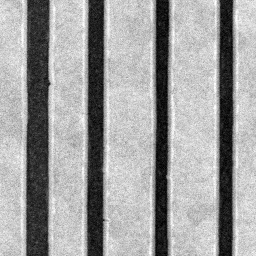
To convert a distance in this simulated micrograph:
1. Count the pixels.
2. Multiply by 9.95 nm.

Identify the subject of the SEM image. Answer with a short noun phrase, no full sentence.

one or a few lines or trenches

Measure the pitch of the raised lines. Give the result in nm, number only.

624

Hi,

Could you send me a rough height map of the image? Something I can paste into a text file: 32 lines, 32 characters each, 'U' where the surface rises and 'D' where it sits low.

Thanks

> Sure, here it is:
UUUDDDDUUUUDDUUUUUUDDUUUUUUDDUUU
UUUDDDDUUUUDDUUUUUUDDUUUUUUDDUUU
UUUDDDDUUUUDDUUUUUUDDUUUUUUDDUUU
UUUDDDDUUUUDDUUUUUUDDDUUUUUDDUUU
UUUDDDDUUUUDDUUUUUUDDUUUUUUDDUUU
UUUDDDDUUUUDDUUUUUUDDUUUUUUDDUUU
UUUDDDUUUUUDDUUUUUUDDUUUUUUDDDUU
UUUDDDUUUUUDDUUUUUUDDUUUUUUDDDUU
UUUDDDUUUUUDDUUUUUUDDUUUUUUDDDUU
UUUDDDUUUUUDDUUUUUUDDUUUUUUDDDUU
UUUDDDUUUUUDDUUUUUUDDUUUUUUDDDUU
UUUDDDUUUUUDDUUUUUUDDUUUUUUDDDUU
UUUDDDUUUUUDDUUUUUUDDUUUUUUDDDUU
UUUDDDUUUUUDDUUUUUUDDUUUUUUDDUUU
UUUDDDUUUUUDDUUUUUUDDUUUUUUDDUUU
UUUDDDUUUUUDDUUUUUUDDUUUUUUDDUUU
UUUDDDUUUUUDDUUUUUUDDUUUUUUDDUUU
UUUDDDUUUUUDDUUUUUUDDUUUUUUDDUUU
UUUDDDUUUUUDDUUUUUUDDUUUUUUDDUUU
UUUDDDUUUUUDDUUUUUUDDUUUUUUDDUUU
UUUDDDUUUUUDDUUUUUUDDUUUUUUDDUUU
UUUDDDUUUUUDDUUUUUUDDUUUUUUDDUUU
UUUDDDUUUUUDDUUUUUUDDUUUUUUDDUUU
UUUDDDUUUUUDDUUUUUUDDUUUUUUDDUUU
UUUDDDUUUUUDDUUUUUUDDUUUUUUDDUUU
UUUDDDUUUUUDDUUUUUUDDUUUUUUDDUUU
UUUDDDUUUUDDDUUUUUUDDUUUUUUDDUUU
UUUDDDUUUUDDDUUUUUUDDUUUUUUDDUUU
UUUDDDUUUUDDDUUUUUUDDUUUUUUDDUUU
UUUDDDUUUUUDDUUUUUUDDUUUUUUDDUUU
UUUDDDUUUUUDDUUUUUUDDUUUUUUDDUUU
UUUDDDUUUUUDDUUUUUUDDUUUUUUDDUUU